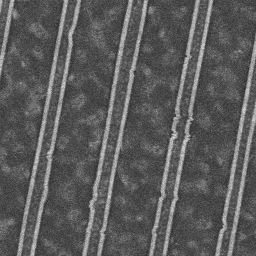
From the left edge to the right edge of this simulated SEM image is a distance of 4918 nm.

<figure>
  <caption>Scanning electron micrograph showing one or a few lines or trenches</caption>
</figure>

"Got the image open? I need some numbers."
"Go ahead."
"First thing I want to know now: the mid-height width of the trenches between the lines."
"51.6 px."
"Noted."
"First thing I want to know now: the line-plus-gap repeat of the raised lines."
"1250 nanometres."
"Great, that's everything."